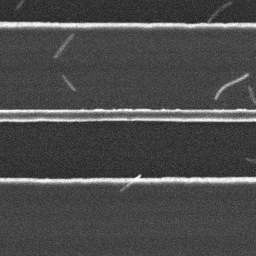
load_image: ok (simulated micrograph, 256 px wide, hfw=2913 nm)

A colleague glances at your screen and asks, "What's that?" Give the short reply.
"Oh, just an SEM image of lines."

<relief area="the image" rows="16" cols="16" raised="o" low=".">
................
................
oooooooooooooooo
oooooooooooooooo
oooooooooooooooo
oooooooooooooooo
oooooooooooooooo
.o..............
................
................
................
oooooooooooooooo
oooooooooooooooo
oooooooooooooooo
oooooooooooooooo
oooooooooooooooo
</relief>